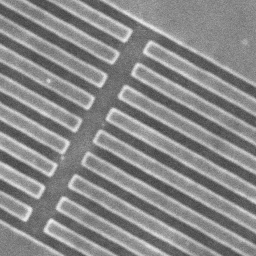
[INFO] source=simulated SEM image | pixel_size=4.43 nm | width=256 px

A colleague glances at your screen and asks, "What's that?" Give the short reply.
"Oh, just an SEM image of groups of lines, slits or small figures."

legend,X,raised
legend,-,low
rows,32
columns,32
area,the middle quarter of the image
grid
XXXXXXX-----------XX------XXXXXX
-XXXXXXXX--------XXXX-------XXXX
---XXXXXXX-------XXXXXX-------XX
-----XXXXX--------XXXXXXX------X
-------XXX----------XXXXXXX-----
XXX-------------------XXXXXXX---
XXXX-----------XXX------XXXXXXX-
XXXXXX--------XXXXX------XXXXXXX
-XXXXXX-------XXXXXXX------XXXXX
---XXXX---------XXXXXXX------XXX
----XX-----------XXXXXXXX------X
------------X------XXXXXXX------
XX---------XXXX------XXXXXXX----
XXXX-------XXXXXX------XXXXXXX--
XXXX-------XXXXXXX------XXXXXXXX
XXXX---------XXXXXXX------XXXXXX
--X------------XXXXXXX------XXXX
--------XXX------XXXXXXX------XX
--------XXXXX------XXXXXXX------
X-------XXXXXX-------XXXXXXX----
X--------XXXXXXX------XXXXXXXX--
-----------XXXXXXX------XXXXXXX-
------X------XXXXXXX------XXXXXX
-----XXXX------XXXXXXX------XXXX
-----XXXXX------XXXXXXX------XXX
-----XXXXXXX------XXXXXXX------X
-------XXXXXXX------XXXXXXX-----
---------XXXXXXX------XXXXXXX---
--XX------XXXXXXX------XXXXXXXX-
--XXXX------XXXXXXX------XXXXXXX
--XXXXXX------XXXXXXX------XXXXX
---XXXXXXX------XXXXXXX------XXX